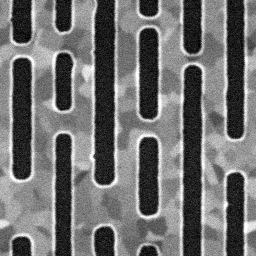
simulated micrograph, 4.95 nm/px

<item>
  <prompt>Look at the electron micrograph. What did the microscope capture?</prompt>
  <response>parallel lines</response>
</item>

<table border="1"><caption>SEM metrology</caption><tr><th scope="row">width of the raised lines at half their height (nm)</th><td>114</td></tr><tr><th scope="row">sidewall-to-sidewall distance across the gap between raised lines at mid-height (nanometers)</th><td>101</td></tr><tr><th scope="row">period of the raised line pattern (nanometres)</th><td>211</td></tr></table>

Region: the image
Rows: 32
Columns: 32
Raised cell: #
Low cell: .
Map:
#...###..###...##...###..###...#
#...###..###..###...###..###...#
#...###..###..#########..###...#
#...###..###..####.####..###...#
#...########..###...###..###...#
##.#########..###...###..###...#
############..###...###..###...#
##..###..###..###...########...#
#...###..###..###...###..###...#
#...###..###..###...###..###...#
#...###..###..###...###..###...#
#...###..###..###...###..###...#
#...###..###..###...###..###...#
#...###..###..###...###..###...#
#...########..####..###..###...#
#...########..#########..###...#
#...########..#########..###...#
#...###..###..####..###..####.##
#...###..###..###...###..#######
#...###..###..###...###..#######
#...###..###..###...###..#######
#...###..###..###...###..####.##
##.####..###..###...###..###...#
#######..########...###..###...#
#######..########...###..###...#
#######..########...###..###...#
#######..########...###..###...#
#######..##############..###...#
#######..###..#########..###...#
##.####..###..#########..###...#
#...###..###..#########..###...#
#...###..###..###...###..###...#